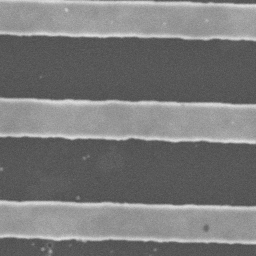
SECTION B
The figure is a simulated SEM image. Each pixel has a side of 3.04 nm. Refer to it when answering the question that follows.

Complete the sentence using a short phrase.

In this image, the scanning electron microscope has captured lines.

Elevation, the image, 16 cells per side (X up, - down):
XXXXXXXXXXXXXXXX
XXXXXXXXXXXXXXXX
----------------
----------------
----------------
----------------
XXXXXXXXXXXXXXX-
XXXXXXXXXXXXXXXX
XXXXXXXXXXXXXXXX
----------------
----------------
----------------
----------------
XXXXXXXXXXXXXXXX
XXXXXXXXXXXXXXXX
----------------